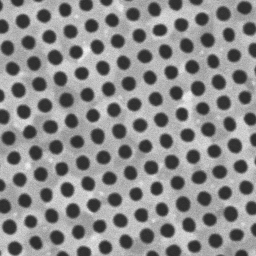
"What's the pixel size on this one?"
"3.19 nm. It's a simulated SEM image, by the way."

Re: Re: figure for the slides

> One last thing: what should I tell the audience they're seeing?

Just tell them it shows a regular array of holes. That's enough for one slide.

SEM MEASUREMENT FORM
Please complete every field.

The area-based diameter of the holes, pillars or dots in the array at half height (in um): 0.046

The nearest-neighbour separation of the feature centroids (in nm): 68.1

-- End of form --